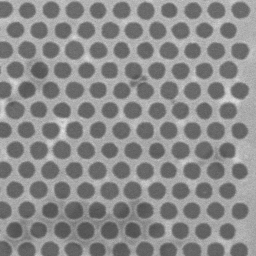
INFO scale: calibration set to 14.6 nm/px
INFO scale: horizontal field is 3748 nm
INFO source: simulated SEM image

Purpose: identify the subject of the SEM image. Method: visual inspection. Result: a regular array of holes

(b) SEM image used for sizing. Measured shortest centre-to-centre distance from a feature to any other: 22.8 px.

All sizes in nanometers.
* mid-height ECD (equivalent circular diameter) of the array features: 265